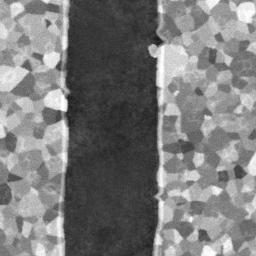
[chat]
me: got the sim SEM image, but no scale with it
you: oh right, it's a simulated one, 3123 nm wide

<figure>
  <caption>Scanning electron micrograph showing one or a few lines or trenches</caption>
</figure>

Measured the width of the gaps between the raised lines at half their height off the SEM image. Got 1.2 micrometres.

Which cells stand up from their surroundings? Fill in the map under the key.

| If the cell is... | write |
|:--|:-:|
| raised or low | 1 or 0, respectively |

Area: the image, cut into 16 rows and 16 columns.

1111000000111111
1111000000111111
1111000000111111
1111000000111111
1111000000111111
1111000000111111
1111000000111111
1111000000111111
1111000000111111
1111000000111111
1111000000111111
1111000000111111
1111000000111111
1111000000111111
1111000000111111
1111000000111111